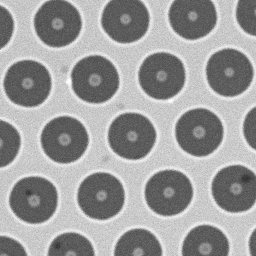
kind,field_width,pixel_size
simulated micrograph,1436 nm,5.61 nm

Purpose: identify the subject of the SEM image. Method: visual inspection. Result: an array of small figures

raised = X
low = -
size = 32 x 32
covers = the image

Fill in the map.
XXXXX----XXXX-----XXX------XXX--
-XXX------XXX------XX------XX---
--XX------XXX--X---XX------XX---
--XX------XXX------XX------XXX--
--XXX-----XXX-----XXXX----XXXXX-
-XXXX----XXXXXX-XXXXXXXXXXXXXXXX
XXXXXXXXXXXXXXXXXXX--XXXXXX---XX
XXX-XXXXXX----XXXX-----XXX-----X
X-----XXX------XX------XXX------
X-----XXX------XX---X--XXX------
---X---XX------XX------XXX-----X
X-----XXX------XXX-----XXXX----X
X-----XXXX----XXXXXX-XXXXXXXXXXX
XXXXXXXXXXXXXXXXXXXXXXXX--XXXXX-
XXXXXXX--XXXXXX---XXXXX----XXXX-
--XXXX----XXXX-----XXX------XX--
--XXX------XX-------XX--X---XX--
---XX---X--XX-------XX------XXX-
---XX------XXX-----XXX-----XXXX-
--XXXX----XXXXX---XXXXXX--XXXXXX
-XXXXXX--XXXXXXXXXXXXXXXXXXXX-XX
XXXXXXXXXXXX-XXXXXX----XXXX-----
XX----XXXX-----XXX------XX------
X------XXX------XX------XX---X--
X------XXX--X---XX------XX------
X---X--XXX------XX------XXX-----
XX-----XXX-----XXXX----XXXXX---X
XXX---XXXXXX--XXXXXXXXXXXXXXXXXX
XXXXXXXXXXXXXXXXX-XXXXXX---XXXXX
-XXXXXX----XXXX-----XXX-----XXX-
---XXX------XX------XXX------XX-
---XXX------XX---X--XXX--X---XX-